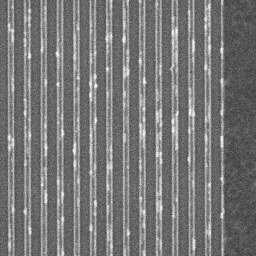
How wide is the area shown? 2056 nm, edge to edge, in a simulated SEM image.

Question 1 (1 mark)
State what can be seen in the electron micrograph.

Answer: parallel lines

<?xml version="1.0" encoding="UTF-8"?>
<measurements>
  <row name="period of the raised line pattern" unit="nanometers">132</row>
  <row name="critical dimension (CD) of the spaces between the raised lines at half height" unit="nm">92.4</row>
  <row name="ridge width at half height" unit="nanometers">42.2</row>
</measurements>